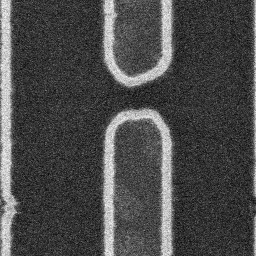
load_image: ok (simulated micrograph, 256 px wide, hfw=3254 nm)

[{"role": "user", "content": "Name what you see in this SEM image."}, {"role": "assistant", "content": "one or a few lines or trenches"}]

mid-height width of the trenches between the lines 1320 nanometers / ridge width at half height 731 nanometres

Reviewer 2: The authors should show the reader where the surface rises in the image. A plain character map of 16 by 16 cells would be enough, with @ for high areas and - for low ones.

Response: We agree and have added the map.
-------@@@------
-------@@@------
-------@@@------
-------@@@------
-------@@@------
----------------
----------------
-------@@@------
-------@@@------
-------@@@------
-------@@@------
-------@@@------
@------@@@------
@------@@@------
-------@@@------
-------@@@------